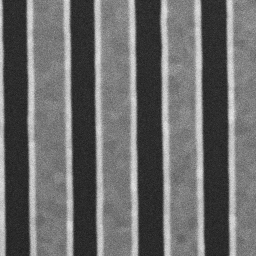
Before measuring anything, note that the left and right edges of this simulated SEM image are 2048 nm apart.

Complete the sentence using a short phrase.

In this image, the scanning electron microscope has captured wiring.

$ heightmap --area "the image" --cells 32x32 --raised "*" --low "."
....****....****.....****....***
....****....****....*****....***
....****....*****...*****....***
....****....*****...*****....***
....****....*****....****....***
....****....*****....****....***
....****....*****....****....***
....****....*****....****....***
....****....*****....****....***
....****....*****....****....***
....****....*****....****....***
....****....*****....****....***
....****....*****....****....***
....*****...*****....****....***
....*****...*****....****....***
....*****...*****....****....***
....*****...*****....****....***
....*****...*****....****....***
....*****...*****....****....***
....*****...*****....****....***
....*****...*****....****....***
....*****...*****....****....***
....*****...*****....****....***
....*****...*****....****....***
....*****...*****....****....***
....*****...*****....****....***
....*****...*****....****....***
....*****...*****....****....***
....*****...*****....****....***
....*****...*****....****....***
....*****....****....****....***
....*****....****....****....***